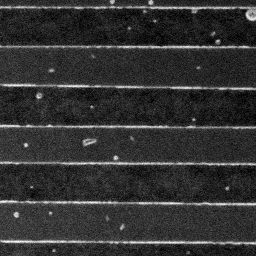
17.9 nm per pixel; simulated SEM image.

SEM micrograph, lines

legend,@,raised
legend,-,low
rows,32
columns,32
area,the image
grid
@@@@@@@@@@@@@@@@@@@@@@@@@@@@@@@@
-------------------------------@
--------------------------------
--------------------------------
--------------------------------
--------------------------------
@@@@@@@@@@@@@@@@@@@@@@@@@@@@@@@@
@@@@@@@@@@@@@@@@@@@@@@@@@@@@@@@@
@@@@@@@@@@@@@@@@@@@@@@@@@@@@@@@@
@@@@@@@@@@@@@@@@@@@@@@@@@@@@@@@@
@@@@@@@@@@@@@@@@@@@@@@@@@@@@@@@@
--------------------------------
--------------------------------
--------------------------------
--------------------------------
--------------------------------
@@@@@@@@@@@@@@@@@@@@@@@@@@@@@@@@
@@@@@@@@@@@@@@@@@@@@@@@@@@@@@@@@
@@@@@@@@@@@@@@@@@@@@@@@@@@@@@@@@
@@@@@@@@@@@@@@@@@@@@@@@@@@@@@@@@
-------------------------@@@@@@@
--------------------------------
--------------------------------
--------------------------------
--------------------------------
@@@@@@@@@@@@@@@@@@@@@@@---------
@@@@@@@@@@@@@@@@@@@@@@@@@@@@@@@@
@@@@@@@@@@@@@@@@@@@@@@@@@@@@@@@@
@@@@@@@@@@@@@@@@@@@@@@@@@@@@@@@@
@@@@@@@@@@@@@@@@@@@@@@@@@@@@@@@@
--------------------------------
--------------------------------